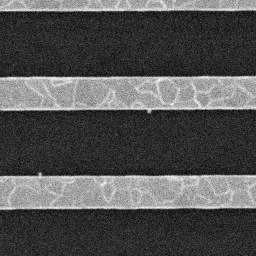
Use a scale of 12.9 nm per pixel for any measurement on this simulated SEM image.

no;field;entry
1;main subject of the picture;wiring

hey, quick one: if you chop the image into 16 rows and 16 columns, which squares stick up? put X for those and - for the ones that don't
XXXXXXXXXXXXXXXX
----------------
----------------
----------------
----------------
XXXXXXXXXXXXXXXX
XXXXXXXXXXXXXXXX
----------------
----------------
----------------
----------------
XXXXXXXXXXXXXXXX
XXXXXXXXXXXXXXXX
----------------
----------------
----------------